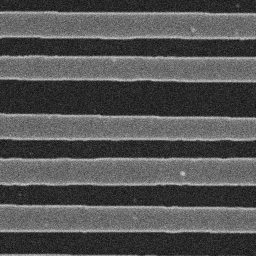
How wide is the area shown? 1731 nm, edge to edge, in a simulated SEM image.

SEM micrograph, lines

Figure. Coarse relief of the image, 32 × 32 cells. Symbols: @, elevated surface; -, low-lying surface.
--------------------------------
--------------------------------
@@@@@@@@@@@@@@@@@@@@@@@@@@@@@@@@
@@@@@@@@@@@@@@@@@@@@@@@@@@@@@@@@
@@@@@@@@@@@@@@@@@@@@@@@@@@@@@@@@
--------------------------------
--------------------------------
@@@@@@@@@@@@@@@@@@@@@@@@@@@@@@@@
@@@@@@@@@@@@@@@@@@@@@@@@@@@@@@@@
@@@@@@@@@@@@@@@@@@@@@@@@@@@@@@@@
--------------------------------
--------------------------------
--------------------------------
--------------------------------
@@@@@@@@@@@@@-------------------
@@@@@@@@@@@@@@@@@@@@@@@@@@@@@@@@
@@@@@@@@@@@@@@@@@@@@@@@@@@@@@@@@
--------@@@---@------@@@@@@@@@@@
--------------------------------
--------------------------------
@@@@@@@@@@@@@@@@@@@@@@@@@@@@@@@@
@@@@@@@@@@@@@@@@@@@@@@@@@@@@@@@@
@@@@@@@@@@@@@@@@@@@@@@@@@@@@@@@@
--------------------------------
--------------------------------
--------------------------------
@@@@@@@@@@@@@@@@@@@@@@@@@@@@@@@@
@@@@@@@@@@@@@@@@@@@@@@@@@@@@@@@@
@@@@@@@@@@@@@@@@@@@@@@@@@@@@@@@@
--------------------------------
--------------------------------
--------------------------------